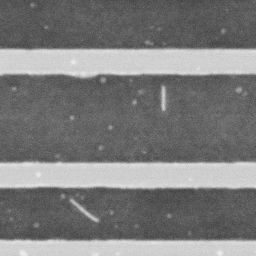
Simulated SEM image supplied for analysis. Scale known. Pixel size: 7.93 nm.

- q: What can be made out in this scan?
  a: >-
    lines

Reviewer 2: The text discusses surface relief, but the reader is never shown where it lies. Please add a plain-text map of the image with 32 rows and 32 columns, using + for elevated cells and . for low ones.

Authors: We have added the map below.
................................
................................
................................
................................
................................
................................
++++++++++++++++++++++++++++++++
++++++++++++++++++++++++++++++++
++++++++++++++++++++++++++++++++
................................
................................
................................
................................
................................
................................
................................
................................
................................
................................
................................
++++++++++++++++++++++++++++++++
++++++++++++++++++++++++++++++++
++++++++++++++++++++++++++++++++
................................
................................
................................
................................
................................
................................
................................
++++++++++++++++++++++++++++++++
++++++++++++++++++++++++++++++++